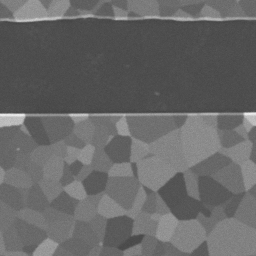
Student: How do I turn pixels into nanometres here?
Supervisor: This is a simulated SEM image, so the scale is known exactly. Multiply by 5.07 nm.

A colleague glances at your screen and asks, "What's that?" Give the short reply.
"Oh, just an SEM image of one or a few lines or trenches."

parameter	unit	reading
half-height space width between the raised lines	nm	486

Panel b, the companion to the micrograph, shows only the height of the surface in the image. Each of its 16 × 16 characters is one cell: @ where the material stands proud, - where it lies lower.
@@@@@@@@@@@@@@@@
----------------
----------------
----------------
----------------
----------------
----------------
@@@@@@@@@@@@@@@@
@@@@@@@@@@@@@@@@
@@@@@@@@@@@@@@@@
@@@@@@@@@@@@@@@@
@@@@@@@@@@@@@@@@
@@@@@@@@@@@@@@@@
@@@@@@@@@@@@@@@@
@@@@@@@@@@@@@@@@
@@@@@@@@@@@@@@@@